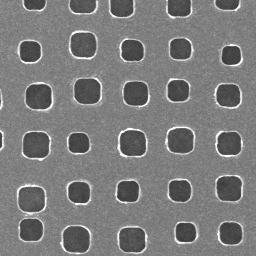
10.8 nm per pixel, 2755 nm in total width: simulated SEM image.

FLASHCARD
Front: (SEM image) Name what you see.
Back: a regular array of holes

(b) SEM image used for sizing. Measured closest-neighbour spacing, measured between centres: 481 nanometres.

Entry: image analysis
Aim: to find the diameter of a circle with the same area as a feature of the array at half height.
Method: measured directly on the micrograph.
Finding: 272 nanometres